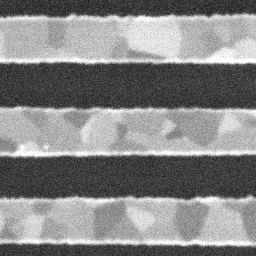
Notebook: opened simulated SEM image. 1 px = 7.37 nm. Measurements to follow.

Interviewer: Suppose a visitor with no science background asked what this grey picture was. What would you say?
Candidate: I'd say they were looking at lines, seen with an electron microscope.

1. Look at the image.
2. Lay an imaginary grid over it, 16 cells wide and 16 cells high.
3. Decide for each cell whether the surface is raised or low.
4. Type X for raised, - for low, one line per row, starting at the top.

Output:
----------------
XXXXXXXXXXXXXXXX
XXXXXXXXXXXXXXXX
XXXXXXXXXXXXXXXX
----------------
----------------
----------------
XXXXXXXXXXXXXXXX
XXXXXXXXXXXXXXXX
XXXXXXXXXXXXXXXX
----------------
----------------
XXXXXXXXXXX-XXXX
XXXXXXXXXXXXXXXX
XXXXXXXXXXXXXXXX
----------------